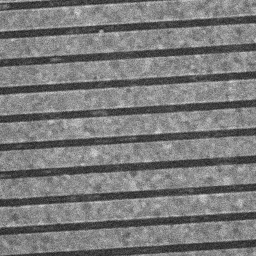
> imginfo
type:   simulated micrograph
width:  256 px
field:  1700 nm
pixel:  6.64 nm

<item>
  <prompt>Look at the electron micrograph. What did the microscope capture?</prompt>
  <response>parallel lines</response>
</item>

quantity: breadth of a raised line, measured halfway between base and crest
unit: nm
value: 127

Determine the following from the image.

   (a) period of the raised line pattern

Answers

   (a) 186 nm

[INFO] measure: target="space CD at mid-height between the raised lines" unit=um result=0.0605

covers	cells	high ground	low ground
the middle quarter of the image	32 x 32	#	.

################################
################################
################################
################................
................................
........................########
........########################
################################
################################
################################
#################...............
#...............................
.........................#######
.......#.#######################
################################
################################
################################
###################.............
###.............................
........................#.######
........########################
################################
################################
################################
####################............
##..............................
........................########
......##########################
################################
################################
################################
#################...............